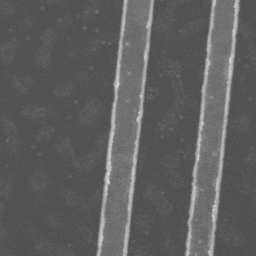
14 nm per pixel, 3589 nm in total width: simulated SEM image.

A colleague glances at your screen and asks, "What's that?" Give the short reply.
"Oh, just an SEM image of one or a few lines or trenches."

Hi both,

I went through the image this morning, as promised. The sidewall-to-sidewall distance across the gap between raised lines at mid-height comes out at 845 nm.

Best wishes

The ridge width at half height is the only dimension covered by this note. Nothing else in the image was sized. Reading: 361 nanometers